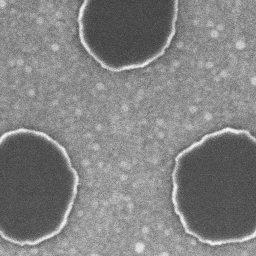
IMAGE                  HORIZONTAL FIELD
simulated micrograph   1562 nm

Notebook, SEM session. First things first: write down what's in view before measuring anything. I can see raised bodies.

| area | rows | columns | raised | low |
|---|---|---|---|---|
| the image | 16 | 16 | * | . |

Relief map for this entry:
.....******.....
.....******.....
.....******.....
......****......
................
................
................
................
***..........***
****.......*****
*****......*****
*****......*****
*****......*****
****.......*****
****........****
................